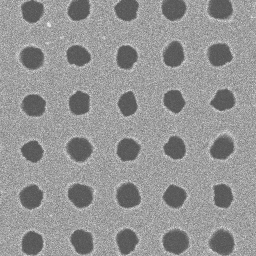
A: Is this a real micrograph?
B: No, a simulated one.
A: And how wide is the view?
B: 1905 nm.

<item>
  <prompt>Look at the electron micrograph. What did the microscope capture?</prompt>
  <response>a regular array of holes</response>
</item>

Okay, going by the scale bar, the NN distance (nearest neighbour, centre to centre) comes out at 45.7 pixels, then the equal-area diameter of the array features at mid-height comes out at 166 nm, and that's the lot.